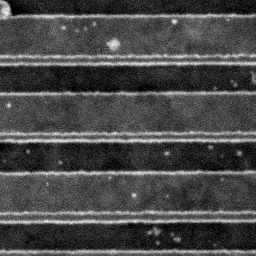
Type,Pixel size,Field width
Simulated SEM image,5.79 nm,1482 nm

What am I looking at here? lines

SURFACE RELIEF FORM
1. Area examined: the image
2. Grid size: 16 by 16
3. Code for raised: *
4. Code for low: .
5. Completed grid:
*...............
****************
****************
****************
................
................
****************
****************
****************
................
................
****************
****************
****************
................
................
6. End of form